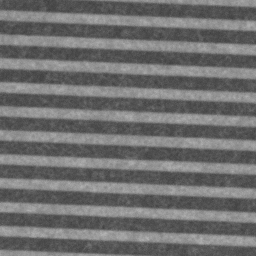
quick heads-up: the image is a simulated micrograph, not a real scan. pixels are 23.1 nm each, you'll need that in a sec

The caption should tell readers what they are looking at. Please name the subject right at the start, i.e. parallel lines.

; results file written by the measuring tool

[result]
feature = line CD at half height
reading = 9.24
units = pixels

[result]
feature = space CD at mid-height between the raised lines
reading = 14.6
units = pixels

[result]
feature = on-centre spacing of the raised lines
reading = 552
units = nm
